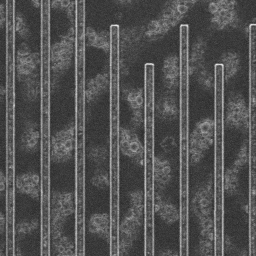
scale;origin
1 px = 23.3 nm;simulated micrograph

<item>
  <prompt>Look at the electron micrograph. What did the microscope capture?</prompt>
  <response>parallel lines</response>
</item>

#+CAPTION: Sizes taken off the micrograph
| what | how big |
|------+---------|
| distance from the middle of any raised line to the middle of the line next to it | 34.8 pixels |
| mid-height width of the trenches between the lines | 0.635 micrometres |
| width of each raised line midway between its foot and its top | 178 nm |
